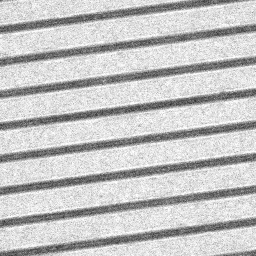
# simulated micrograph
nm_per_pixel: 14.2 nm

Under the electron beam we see parallel lines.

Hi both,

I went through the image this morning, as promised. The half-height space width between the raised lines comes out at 125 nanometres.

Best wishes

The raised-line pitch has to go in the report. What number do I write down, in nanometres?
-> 454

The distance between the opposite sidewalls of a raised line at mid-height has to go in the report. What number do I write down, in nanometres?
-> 334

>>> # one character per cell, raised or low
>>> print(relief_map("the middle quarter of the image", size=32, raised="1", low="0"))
11111111111111111111111111110000
11111111111111111111100000000000
11111111111110000000000000000001
11111100000000000000000111111111
00000000000000001111111111111111
00000000011111111111111111111111
01111111111111111111111111111111
11111111111111111111111111111111
11111111111111111111111111111000
11111111111111111111110000000000
11111111111111000000000000000000
11111110000000000000000111111111
00000000000000011111111111111111
00000000001111111111111111111111
00111111111111111111111111111111
11111111111111111111111111111111
11111111111111111111111111111000
11111111111111111111100000000000
11111111111111000000000000000000
11111100000000000000000011111111
00000000000000000111111111111111
00000000011111111111111111111111
00111111111111111111111111111111
11111111111111111111111111111111
11111111111111111111111111111100
11111111111111111111110000000000
11111111111111100000000000000000
11111111000000000000000001111111
00000000000000000011111111111111
00000000001111111111111111111111
00011111111111111111111111111111
11111111111111111111111111111111